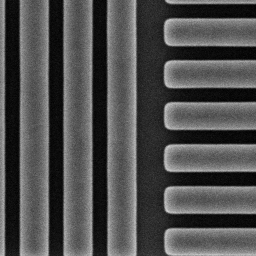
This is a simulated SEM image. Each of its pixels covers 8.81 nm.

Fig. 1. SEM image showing groups of lines, slits or small figures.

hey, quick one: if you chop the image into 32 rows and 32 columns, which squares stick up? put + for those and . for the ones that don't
+..+++..+++..++++...............
+..+++..+++..++++...............
+..+++..+++..++++....+++++++++++
+..+++..+++..++++....+++++++++++
+..+++..+++..++++....+++++++++++
+..+++..+++..++++....+++++++++++
...+++..+++..++++...............
+..+++..+++..++++...............
+..+++..+++..++++....+++++++++++
+..+++..+++..++++....+++++++++++
...+++..+++..++++....+++++++++++
+..+++..+++..++++...............
...+++..+++..++++...............
...+++..+++..++++....+++++++++++
...+++..+++..++++....+++++++++++
+..+++..+++..++++....+++++++++++
+..+++..+++..++++...............
+..+++..+++..++++...............
...+++..+++..++++....+++++++++++
...+++..+++..++++....+++++++++++
+..+++..+++..++++....+++++++++++
+..+++..+++..++++...............
+..+++..+++..++++...............
+..+++..+++..++++....+++++++++++
+..+++..+++..++++....+++++++++++
...+++..+++..++++....+++++++++++
+..+++..+++..++++....+++++++++++
+..+++..+++..++++...............
+..+++..+++..++++...............
...+++..+++..++++....+++++++++++
...+++..+++..++++....+++++++++++
+..+++..+++..++++....+++++++++++